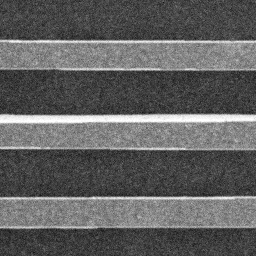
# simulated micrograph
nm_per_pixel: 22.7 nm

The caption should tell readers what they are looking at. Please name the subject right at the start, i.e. lines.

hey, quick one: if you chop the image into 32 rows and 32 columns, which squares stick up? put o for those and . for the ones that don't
................................
................................
................................
................................
................................
oooooooooooooooooooooooooooooooo
oooooooooooooooooooooooooooooooo
oooooooooooooooooooooooooooooooo
oooooooooooooooooooooooooooooooo
................................
................................
................................
................................
................................
................................
oooooooooooooooooooooooooooooooo
oooooooooooooooooooooooooooooooo
oooooooooooooooooooooooooooooooo
....oooooooooooooooooooooooooooo
................................
................................
................................
................................
................................
................................
oooooooooooooooooooooooooooooooo
oooooooooooooooooooooooooooooooo
oooooooooooooooooooooooooooooooo
................................
................................
................................
................................